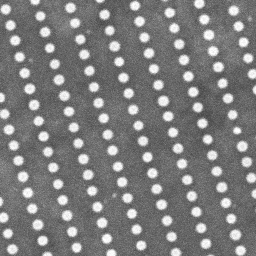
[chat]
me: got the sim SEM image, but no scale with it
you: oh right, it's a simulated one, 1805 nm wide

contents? a regular array of raised bodies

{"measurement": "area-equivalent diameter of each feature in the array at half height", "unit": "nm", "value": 58.5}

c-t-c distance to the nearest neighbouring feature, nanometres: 116